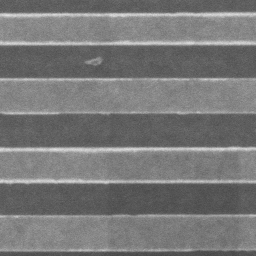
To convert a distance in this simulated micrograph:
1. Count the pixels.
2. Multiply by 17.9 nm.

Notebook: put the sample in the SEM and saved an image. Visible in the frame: lines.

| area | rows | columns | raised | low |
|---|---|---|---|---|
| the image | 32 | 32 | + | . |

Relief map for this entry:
................................
................................
++++++++++++++++++++++++++++++++
++++++++++++++++++++++++++++++++
++++++++++++++++++++++++++++++++
++++++++++++++++++++++++++++++++
................................
................................
................................
................................
++++++++++++++++++++++++++++++++
++++++++++++++++++++++++++++++++
++++++++++++++++++++++++++++++++
++++++++++++++++++++++++++++++++
................................
................................
................................
................................
................................
++++++++++++++++++++++++++++++++
++++++++++++++++++++++++++++++++
++++++++++++++++++++++++++++++++
++++++++++++++++++++++++++++++++
................................
................................
................................
................................
++++++++++++++++++++++++++++++++
++++++++++++++++++++++++++++++++
++++++++++++++++++++++++++++++++
++++++++++++++++++++++++++++++++
................................